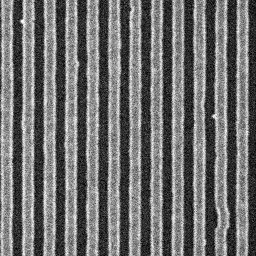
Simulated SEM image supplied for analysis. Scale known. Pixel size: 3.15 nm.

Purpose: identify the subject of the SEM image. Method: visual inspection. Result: parallel lines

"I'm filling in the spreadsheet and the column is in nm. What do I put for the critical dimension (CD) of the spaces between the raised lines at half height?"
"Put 36.3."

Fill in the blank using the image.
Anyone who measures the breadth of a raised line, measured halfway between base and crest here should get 29.9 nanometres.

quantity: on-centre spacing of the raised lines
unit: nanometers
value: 67.5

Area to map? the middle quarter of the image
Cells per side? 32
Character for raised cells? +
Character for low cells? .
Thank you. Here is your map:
.++...++...+++...++...++...+++..
.++...++...+++...++...++...+++..
.++...++...+++...++...++...+++..
.++...++...+++...++...++...+++..
.++...++...+++...++...++...+++..
.++...++...+++...++...++...+++..
.++...++...+++...++...++...+++..
.++...++...+++...++...++...+++..
.++...++...+++...++...++...+++..
.++...++...+++...++...++...+++..
.++...++...+++...++...++...+++..
.++...++...+++...++...++...+++..
.++...++...+++...++...++...+++..
.++...++...+++...++...++...+++..
.++...++...+++...++...++...+++..
+++...++...+++...++...++...+++..
+++...++...+++...++...++...+++..
.++...++...+++...++...++...+++..
+++...++...+++...++...++...+++..
+++...++...+++...++...++...+++..
+++...++...+++...++...++...++...
+++...++...+++...++...++...++...
.++...++...+++...++...++...+++..
.++...++....++...++...++...+++..
.++...++...+++...++...++...++...
.++...++...+++...++...++...++...
.++...++...+++...++...++...++...
.++...++...+++...++...++...++...
.++...++...+++...++...++...++...
.++...++...+++...++...++....++..
.++...++...+++...++...++...+++..
.++...++...+++...++...++...+++..